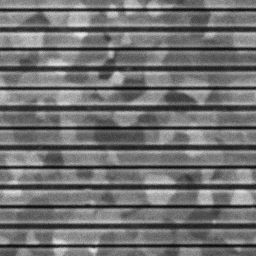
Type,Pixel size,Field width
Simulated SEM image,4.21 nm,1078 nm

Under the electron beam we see parallel lines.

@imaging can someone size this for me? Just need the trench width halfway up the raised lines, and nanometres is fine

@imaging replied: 21.6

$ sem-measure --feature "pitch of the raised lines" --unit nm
83.4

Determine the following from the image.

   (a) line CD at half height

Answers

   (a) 56.8 nm